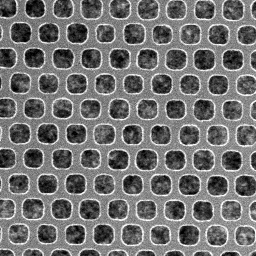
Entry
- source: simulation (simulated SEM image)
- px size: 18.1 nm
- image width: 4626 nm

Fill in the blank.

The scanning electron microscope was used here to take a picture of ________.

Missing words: a regular array of holes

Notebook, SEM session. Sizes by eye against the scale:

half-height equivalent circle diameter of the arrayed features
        385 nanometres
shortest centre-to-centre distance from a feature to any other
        509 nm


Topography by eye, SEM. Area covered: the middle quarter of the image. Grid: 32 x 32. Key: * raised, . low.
..***....***....***....***.....*
*********************.*****.****
**..******.*************.*******
*.....**....***.....**.....**...
*.....**.....**.....**.....**...
*.....**.....**.....**.....**...
*.....**.....**.....**.....**...
**..*****..************...****..
********************************
..***....***....***....***....**
..**.....**.....**......**....**
..**.....**.....**.....**......*
..**.....**.....**.....***....**
.****...****....***....***....**
********************************
*....***....****...****.*.****..
*.....**.....**.....**....***...
*.....*......**.....**.....**...
*.....**.....**.....**.....**...
*....***....***....***....***...
********************************
.****...*****..****...*****..***
..**.....**.....**.....**.....**
..**.....**.....**......*.....**
..**.....**.....**.....**......*
..***....**.....**.....**.....**
*************..****...*****..***
***.****************************
*....***....***....***.....**...
......**.....**.....**.....**...
......*......**.....**.....**...
*....***....***.....**.....**...